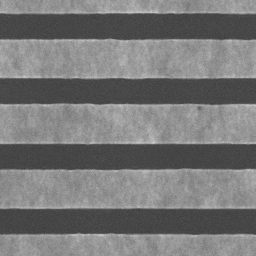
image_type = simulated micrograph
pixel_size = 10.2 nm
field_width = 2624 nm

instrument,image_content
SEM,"lines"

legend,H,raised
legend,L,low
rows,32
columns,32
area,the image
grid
HHHHHHHHHHHHHHHHHHHHHHHHHHHHHHHH
HHHHHHHHHHHHHHHHHHHHHHHHHHHHHHHH
LLLLLLLLLLLLLLLLLLLLLLLLLLLLLLLL
LLLLLLLLLLLLLLLLLLLLLLLLLLLLLLLL
LLLLLLLLLLLLLLLLLLLLLLLLLLLLLLLL
HHHHHHHHHHHHHHHHHHHHHHHHHHHHHHHH
HHHHHHHHHHHHHHHHHHHHHHHHHHHHHHHH
HHHHHHHHHHHHHHHHHHHHHHHHHHHHHHHH
HHHHHHHHHHHHHHHHHHHHHHHHHHHHHHHH
HHHHHHHHHHHHHHHHHHHHHHHHHHHHHHHH
LLLLLLLLLLLLLLLLLLLLLLLLLLLLLLLL
LLLLLLLLLLLLLLLLLLLLLLLLLLLLLLLL
LLLLLLLLLLLLLLLLLLLLLLLLLLLLLLLL
HHHHHHHHHHHHHHHHHHHHHHHHHHHHHHHH
HHHHHHHHHHHHHHHHHHHHHHHHHHHHHHHH
HHHHHHHHHHHHHHHHHHHHHHHHHHHHHHHH
HHHHHHHHHHHHHHHHHHHHHHHHHHHHHHHH
HHHHHHHHHHHHHHHHHHHHHHHHHHHHHHHH
LLLLLLLLLLLLLLLLLLLLLLLLLLLLLLLL
LLLLLLLLLLLLLLLLLLLLLLLLLLLLLLLL
LLLLLLLLLLLLLLLLLLLLLLLLLLLLLLLL
HHHHHHHHHHHHHHHHHHHHHHHHHHHHHHHH
HHHHHHHHHHHHHHHHHHHHHHHHHHHHHHHH
HHHHHHHHHHHHHHHHHHHHHHHHHHHHHHHH
HHHHHHHHHHHHHHHHHHHHHHHHHHHHHHHH
HHHHHHHHHHHHHHHHHHHHHHHHHHHHHHHH
LLLLLLLLLLLLLLLLLLLLLLLLLLLLLLLL
LLLLLLLLLLLLLLLLLLLLLLLLLLLLLLLL
LLLLLLLLLLLLLLLLLLLLLLLLLLLLLLLL
HHHHHHHHHHHHHHHHHHHHHHHHHHHHHHHH
HHHHHHHHHHHHHHHHHHHHHHHHHHHHHHHH
HHHHHHHHHHHHHHHHHHHHHHHHHHHHHHHH